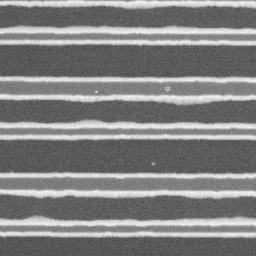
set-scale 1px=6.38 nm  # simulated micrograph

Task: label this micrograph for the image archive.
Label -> lines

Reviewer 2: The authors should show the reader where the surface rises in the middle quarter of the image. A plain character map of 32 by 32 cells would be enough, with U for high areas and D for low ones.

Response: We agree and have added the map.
DDDDDDDDDDDDDDDDDDDDDDDDDDDDDDDD
DDDDDDDDDDDDDDDDDDDDDDDDDDDDDDDD
DDDDDDDDDDDDDDDDDDDDDDDDDDDDDDDD
DDDDDDDDDDDDDDDDDDDDDDDDDDDDDDDD
UUUUUUUUUUUUUUUUUUUUUUUUUUUUUUUU
UUUUUUUUUUUUUUUUUUUUUUUUUUUUUUUU
UUUUUUUUUUUUUUUUUUUUUUUUUUUUUUUU
UUUUUUUUUUUUUUUUUUUUUUUUUUUUUUUU
DUUUUUUUUUUUDDDUDUUUUUUUUUUUUUUU
DDDDDDDDDDDDDDDDDDDDDDDDDDDDDDDD
DDDDDDDDDDDDDDDDDDDDDDDDDDDDDDDD
DDDDDDDDDDDDDDDDDDDDDDDDDDDDDDDD
DDDDDDDDDDDDDDDDDDDDDDDDDDDDDDDD
DDDDDDDDDDDDDDDDDDDDDDDDDDDDDDDD
DDDDDDDDDDDDDDDDDDDDDDDDDDDDDDDD
DUUUUUUUUUUUUUUUUUDDDUUDDDDUUUUU
UUUUUUUUUUUUUUUUUUUUUUUUUUUUUUUU
UUUUUUUUUUUUUUUUUUUUUUUUUUUUUUUU
DDDDDDDDDDDDDDDDDDDDDDDDDDDDDDDD
DDDDDDDDDDDDDDDDDDDDDDDDDDDDDDDD
DDDDDDDDDDDDDDDDDDDDDDDDDDDDDDDD
DDDDDDDDDDDDDDDDDDDDDDDDDDDDDDDD
DDDDDDDDDDDDDDDDDDDDDDDDDDDDDDDD
DDDDDDDDDDDDDDDDDDDDDDDDDDDDDDDD
DDDDDDDDDDDDDDDDDDDDDDDDDDDDDDDD
DDDDDDDDDDDDDDDDDDDDDDDDDDDDDDDD
DDDDDDDDDDDDDDDDDDDDDDDDDDDDDDDD
DDDDDDDDDDDDDDDDDDDDDDDDDDDDDDDD
UUUUUUUUUUUUUUUUUUUUUUUUUUUUUUUU
UUUUUUUUUUUUUUUUUUUUUUUUUUUUUUUU
UUUUUUUUUUUUUUUUUUUUUUUUUUUUUUUU
UUUUUUUUUUUUUUUUUUUUUUUUUUUUUUUU